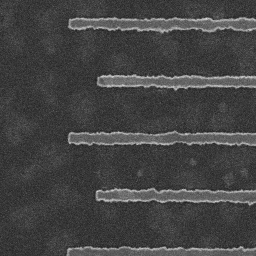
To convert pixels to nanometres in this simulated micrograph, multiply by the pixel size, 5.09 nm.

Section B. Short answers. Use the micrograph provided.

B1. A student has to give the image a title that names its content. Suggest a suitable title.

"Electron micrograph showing parallel lines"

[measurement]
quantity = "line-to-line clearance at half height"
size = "238 nanometers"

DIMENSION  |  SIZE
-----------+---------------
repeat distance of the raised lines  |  57.2 px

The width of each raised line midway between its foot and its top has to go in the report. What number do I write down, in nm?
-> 54.7